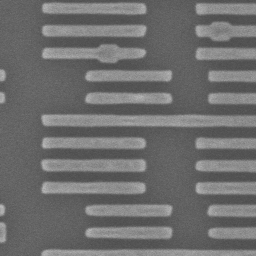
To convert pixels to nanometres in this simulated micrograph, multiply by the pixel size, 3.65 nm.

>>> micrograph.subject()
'wiring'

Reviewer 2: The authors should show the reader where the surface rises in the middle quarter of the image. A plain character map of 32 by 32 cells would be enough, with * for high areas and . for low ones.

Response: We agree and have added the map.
................................
................................
......*********************.....
......*********************.....
................................
................................
................................
......***********.********......
......*********************.....
......*********************.....
................................
................................
................................
********************************
********************************
....****...................*****
................................
................................
................................
********************............
********************............
................................
................................
................................
********************............
********************............
********************............
................................
................................
................................
********************............
********************............